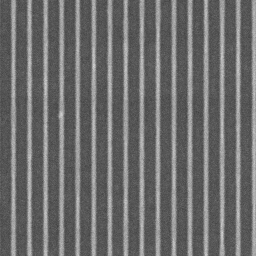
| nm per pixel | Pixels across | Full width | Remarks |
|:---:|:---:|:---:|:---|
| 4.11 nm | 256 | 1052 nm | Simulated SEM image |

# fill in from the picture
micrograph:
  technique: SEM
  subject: parallel lines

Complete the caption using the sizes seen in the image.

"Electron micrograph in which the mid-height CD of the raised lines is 11.3 nm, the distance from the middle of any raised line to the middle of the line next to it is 66 nanometers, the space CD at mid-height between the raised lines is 55.5 nm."